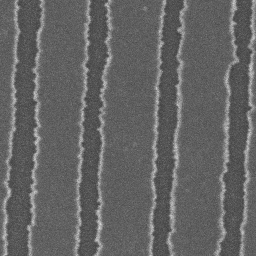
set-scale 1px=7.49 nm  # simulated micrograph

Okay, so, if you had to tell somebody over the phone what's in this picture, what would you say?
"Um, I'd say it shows one or a few lines or trenches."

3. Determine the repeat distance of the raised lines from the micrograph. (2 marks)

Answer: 535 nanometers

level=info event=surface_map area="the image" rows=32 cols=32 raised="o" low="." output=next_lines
oo...oooooo..oooooooo..oooooo...
oo...oooooo..ooooooo...oooooo...
oo...oooooo..ooooooo...oooooo..o
oo...oooooo...oooooo...oooooo...
oo...oooooo...oooooo...oooooo...
oo...oooooo..ooooooo...oooooo..o
oo...oooooo...oooooo..ooooooo...
oo...oooooo...oooooo..oooooooo.o
oo..ooooooo..ooooooo...oooooo..o
oo...oooooo..ooooooo..oooooo...o
oo...oooooo..ooooooo..oooooo...o
oo..ooooooo..ooooooo..ooooooo..o
oo...ooooo...ooooooo..ooooooo..o
oo...ooooo...ooooooo..ooooooo..o
oo..oooooo...ooooooo..oooooo...o
oo...ooooo...ooooooo..oooooo...o
oo..oooooo...ooooooo..oooooo...o
o....ooooo...ooooooo..oooooo...o
o....ooooo...oooooo...oooooo...o
o...oooooo...ooooooo..oooooo...o
o...oooooo...oooooo...oooooo...o
o...oooooo..ooooooo...oooooo...o
o...oooooo..ooooooo...oooooo...o
o...oooooo..ooooooo...oooooo...o
o...oooooo..ooooooo..ooooooo...o
o...oooooo...oooooo..ooooooo...o
o...oooooo..ooooooo..ooooooo...o
o...oooooo..ooooooo..ooooooo..oo
o...oooooo..ooooooo..ooooooo..oo
o...oooooo..ooooooo..ooooooo..oo
o...oooooo..ooooooo..oooooo...oo
o...oooooo..ooooooo..oooooo...oo